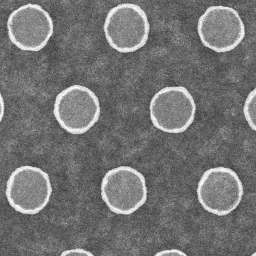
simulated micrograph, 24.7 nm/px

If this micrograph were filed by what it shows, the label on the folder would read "a regular array of raised bodies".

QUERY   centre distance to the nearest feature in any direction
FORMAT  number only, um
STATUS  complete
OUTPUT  2.32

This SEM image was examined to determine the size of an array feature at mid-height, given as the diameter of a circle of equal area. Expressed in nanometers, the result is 1080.